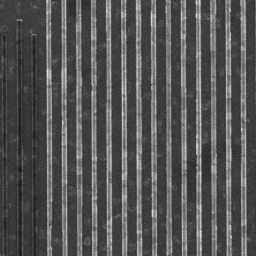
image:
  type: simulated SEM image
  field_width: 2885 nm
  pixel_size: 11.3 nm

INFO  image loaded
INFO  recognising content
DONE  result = parallel lines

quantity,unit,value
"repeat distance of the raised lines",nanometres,168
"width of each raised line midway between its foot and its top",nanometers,47.9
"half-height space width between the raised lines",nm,125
